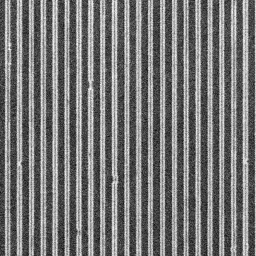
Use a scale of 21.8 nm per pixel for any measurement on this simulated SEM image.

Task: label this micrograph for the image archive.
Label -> parallel lines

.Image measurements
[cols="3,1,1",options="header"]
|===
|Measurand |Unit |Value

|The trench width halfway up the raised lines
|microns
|0.183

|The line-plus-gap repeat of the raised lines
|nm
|260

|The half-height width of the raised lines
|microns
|0.0818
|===